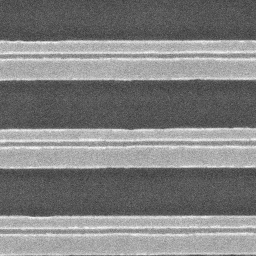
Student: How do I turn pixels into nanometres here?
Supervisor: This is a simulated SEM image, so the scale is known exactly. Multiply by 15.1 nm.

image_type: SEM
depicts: lines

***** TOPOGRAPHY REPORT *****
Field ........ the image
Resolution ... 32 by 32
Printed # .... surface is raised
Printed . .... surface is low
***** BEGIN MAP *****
................................
................................
................................
................................
................................
################################
################################
################################
################################
################################
................................
................................
................................
................................
................................
................................
################################
################################
################################
################################
################################
................................
................................
................................
................................
................................
................................
################################
################################
################################
################################
################################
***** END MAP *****